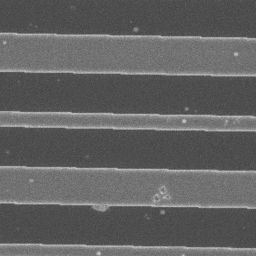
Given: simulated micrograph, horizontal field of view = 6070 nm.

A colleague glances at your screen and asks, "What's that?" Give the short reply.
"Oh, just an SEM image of lines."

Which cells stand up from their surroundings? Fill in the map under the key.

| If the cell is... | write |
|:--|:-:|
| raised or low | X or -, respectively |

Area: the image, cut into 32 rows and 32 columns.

--------------------------------
--------------------------------
--------------------------------
--------------------------------
XXXXXXXXXXXXXX------------------
XXXXXXXXXXXXXXXXXXXXXXXXXXXXXXXX
XXXXXXXXXXXXXXXXXXXXXXXXXXXXXXXX
XXXXXXXXXXXXXXXXXXXXXXXXXXXXXXXX
XXXXXXXXXXXXXXXXXXXXXXXXXXXXXXXX
--------------------------------
--------------------------------
--------------------------------
--------------------------------
--------------------------------
XXXXXXXXXXXXXXXXXXXXXXXXXXX-----
XXXXXXXXXXXXXXXXXXXXXXXXXXXXXXXX
--------------------------------
--------------------------------
--------------------------------
--------------------------------
--------------------------------
XXXXXXXXXXXXXXXXXXXXXXXXXXXXXXXX
XXXXXXXXXXXXXXXXXXXXXXXXXXXXXXXX
XXXXXXXXXXXXXXXXXXXXXXXXXXXXXXXX
XXXXXXXXXXXXXXXXXXXXXXXXXXXXXXXX
-------XXXXXXXXXXXXXXXXXXXXXXXXX
--------------------------------
--------------------------------
--------------------------------
--------------------------------
--------------------------------
XXXXXXXXXXXXXXXXXXXXXXXXXXXXXXXX